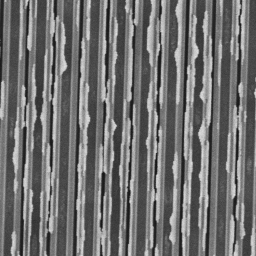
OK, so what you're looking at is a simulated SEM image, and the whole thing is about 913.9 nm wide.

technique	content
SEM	parallel lines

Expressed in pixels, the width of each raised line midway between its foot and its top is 7.37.